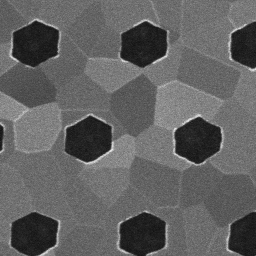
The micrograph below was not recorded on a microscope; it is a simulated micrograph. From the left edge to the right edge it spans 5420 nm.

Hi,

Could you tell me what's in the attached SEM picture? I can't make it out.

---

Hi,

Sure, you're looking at holes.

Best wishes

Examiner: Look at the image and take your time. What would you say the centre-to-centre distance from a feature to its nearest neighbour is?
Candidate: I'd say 2300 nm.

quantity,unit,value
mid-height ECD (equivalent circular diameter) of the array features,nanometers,973